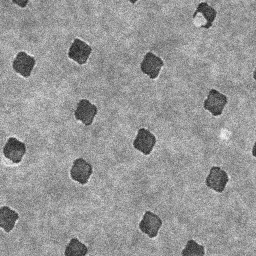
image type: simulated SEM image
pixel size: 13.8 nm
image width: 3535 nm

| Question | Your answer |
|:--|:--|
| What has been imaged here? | a regular array of holes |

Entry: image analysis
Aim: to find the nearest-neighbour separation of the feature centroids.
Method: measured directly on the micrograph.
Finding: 967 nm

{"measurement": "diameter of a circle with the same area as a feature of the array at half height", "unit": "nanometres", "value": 330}